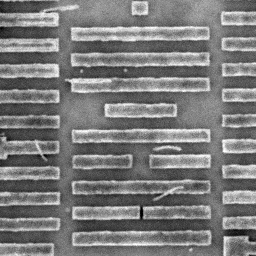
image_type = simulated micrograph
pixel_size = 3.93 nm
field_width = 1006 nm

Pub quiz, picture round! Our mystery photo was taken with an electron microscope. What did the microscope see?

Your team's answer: wiring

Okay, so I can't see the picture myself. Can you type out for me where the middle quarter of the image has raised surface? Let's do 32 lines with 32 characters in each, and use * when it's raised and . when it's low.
................................
................................
................................
................................
.*******************************
..******************************
..******************************
................................
................................
................................
..........******************....
..........******************....
..........******************....
................................
................................
................................
................................
..******************************
..******************************
..****.***..*************.......
................................
................................
................................
..***************.....**********
..***************.....**********
..***************.....**********
................................
................................
................................
..******************************
..******************************
..******************************